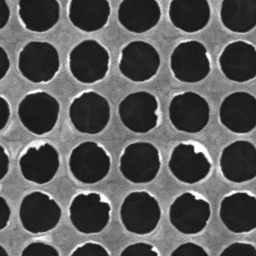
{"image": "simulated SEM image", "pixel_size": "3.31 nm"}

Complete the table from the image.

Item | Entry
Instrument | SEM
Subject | a regular array of holes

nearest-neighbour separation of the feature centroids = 164 nm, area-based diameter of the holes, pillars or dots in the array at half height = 135 nm